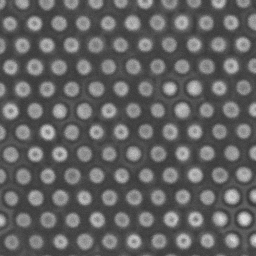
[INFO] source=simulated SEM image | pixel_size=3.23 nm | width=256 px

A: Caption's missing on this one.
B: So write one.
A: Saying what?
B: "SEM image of a regular array of raised bodies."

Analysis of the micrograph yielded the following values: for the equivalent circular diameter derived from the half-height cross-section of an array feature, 45.7 nm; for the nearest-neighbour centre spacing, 78.4 nanometers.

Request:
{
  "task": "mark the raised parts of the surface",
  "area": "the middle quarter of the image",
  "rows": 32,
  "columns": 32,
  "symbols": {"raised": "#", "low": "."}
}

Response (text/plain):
...####...###...###...###...###.
....###...###...###...###...###.
....##..........................
................................
....................#.....#.....
###...####...###...###...###...#
####..####...###...###...###...#
###....###...##....##.....#.....
................................
................................
....##....###...###...###...###.
...####...###...###...###...###.
...####...###...###...###...###.
................................
................................
.##....##....##.....##...##.....
###...####...###...###...###...#
###...####...###...###...###...#
.##....##....##.....#....###....
................................
................................
#...##....##....###...###...###.
#...###...###...###...###...###.
#...##....###...###...###...###.
................................
................................
.##....##.....#.....##...###...#
####...###...###...###...###...#
####...###...###...###...###...#
.##.....#.................#.....
................................
................................